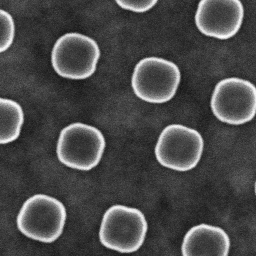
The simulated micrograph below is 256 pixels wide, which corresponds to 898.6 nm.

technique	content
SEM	raised bodies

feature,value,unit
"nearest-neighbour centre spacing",286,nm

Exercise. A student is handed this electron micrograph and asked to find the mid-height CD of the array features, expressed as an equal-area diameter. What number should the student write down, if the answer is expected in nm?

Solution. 159